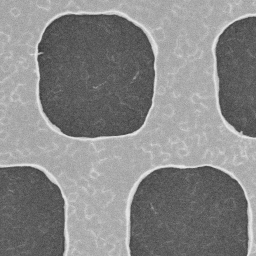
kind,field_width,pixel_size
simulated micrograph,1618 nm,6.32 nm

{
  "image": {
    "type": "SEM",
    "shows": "holes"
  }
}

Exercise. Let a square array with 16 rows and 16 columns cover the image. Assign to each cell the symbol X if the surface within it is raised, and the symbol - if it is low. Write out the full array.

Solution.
XXXXXXXXXXXXXXXX
XXX------XXXXX--
XXX------XXXXX--
XX--------XXX---
XX--------XXX---
XX--------XXXX--
XX-------XXXXX--
XXX------XXXXX--
XXXX---XXXXXXXX-
XXXXXXXXXXXXXXXX
--XXXXXXXX---XXX
---XXXXXX------X
----XXXX-------X
----XXXX--------
----XXXX--------
----XXXX--------